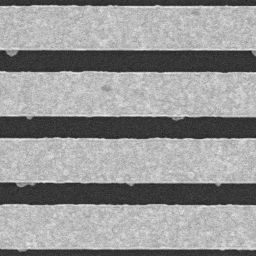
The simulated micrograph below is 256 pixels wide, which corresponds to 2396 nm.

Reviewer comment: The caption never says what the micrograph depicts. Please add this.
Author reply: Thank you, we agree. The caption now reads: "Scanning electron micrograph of lines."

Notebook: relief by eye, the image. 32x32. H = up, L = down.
LLLLLLLLLLLLLLLLLLLLLLLLLLLLLLLL
HHHHHHHHHHHHHHHHHHHHHHHHHHHHHHHH
HHHHHHHHHHHHHHHHHHHHHHHHHHHHHHHH
HHHHHHHHHHHHHHHHHHHHHHHHHHHHHHHH
HHHHHHHHHHHHHHHHHHHHHHHHHHHHHHHH
HHHHHHHHHHHHHHHHHHHHHHHHHHHHHHHH
LLLLLLLLLLLLLLLLLLLLLLLLLLLLLLLL
LLLLLLLLLLLLLLLLLLLLLLLLLLLLLLLL
LLLLLLLLLLLLLLLLLLLLLLLLLLLLLLLL
HHHHHHHHHHHHHHHHHHHHHHHHHHHHHHHH
HHHHHHHHHHHHHHHHHHHHHHHHHHHHHHHH
HHHHHHHHHHHHHHHHHHHHHHHHHHHHHHHH
HHHHHHHHHHHHHHHHHHHHHHHHHHHHHHHH
HHHHHHHHHHHHHHHHHHHHHHHHHHHHHHHH
LLLLLLLLLLLLLLLLLLLLLLLLLLLLLLLL
LLLLLLLLLLLLLLLLLLLLLLLLLLLLLLLL
LLLLLLLLLLLLLLLLLLLLLLLLLLLLLLLL
HHHHHHHHHHHHHHHHHHHHHHHHHHHHHHHH
HHHHHHHHHHHHHHHHHHHHHHHHHHHHHHHH
HHHHHHHHHHHHHHHHHHHHHHHHHHHHHHHH
HHHHHHHHHHHHHHHHHHHHHHHHHHHHHHHH
HHHHHHHHHHHHHHHHHHHHHHHHHHHHHHHH
HHHHHHHHHHHHHHHHHHHHHHHHHHHHHHHH
LLLLLLLLLLLLLLLLLLLLLLLLLLLLLLLL
LLLLLLLLLLLLLLLLLLLLLLLLLLLLLLLL
LLLLLLLLLLLLLLLLLLLLLLLLLLLLLLLL
HHHHHHHHHHHHHHHHHHHHHHHHHHHHHHHH
HHHHHHHHHHHHHHHHHHHHHHHHHHHHHHHH
HHHHHHHHHHHHHHHHHHHHHHHHHHHHHHHH
HHHHHHHHHHHHHHHHHHHHHHHHHHHHHHHH
HHHHHHHHHHHHHHHHHHHHHHHHHHHHHHHH
LLLLLLLLLLLLLLLLLLLLLLLLLLLLLLLL